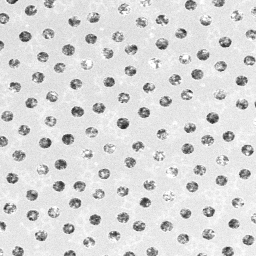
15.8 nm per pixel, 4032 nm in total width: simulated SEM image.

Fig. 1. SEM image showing a regular array of holes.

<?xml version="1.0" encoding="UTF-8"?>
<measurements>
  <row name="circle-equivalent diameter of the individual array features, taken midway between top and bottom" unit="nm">188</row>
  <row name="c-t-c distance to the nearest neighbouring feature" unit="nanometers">336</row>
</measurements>